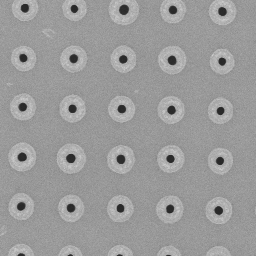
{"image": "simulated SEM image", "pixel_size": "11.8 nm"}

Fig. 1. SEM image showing a regular array of ring-shaped raised bodies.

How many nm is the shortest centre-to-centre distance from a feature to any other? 578